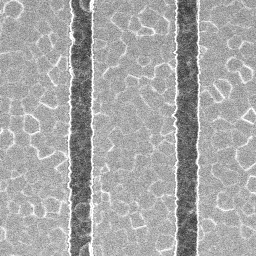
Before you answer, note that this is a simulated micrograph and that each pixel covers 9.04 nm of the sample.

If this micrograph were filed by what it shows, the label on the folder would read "one or a few lines or trenches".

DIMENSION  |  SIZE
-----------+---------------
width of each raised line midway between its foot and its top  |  201 nanometers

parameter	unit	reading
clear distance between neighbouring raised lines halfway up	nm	751